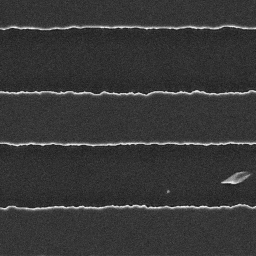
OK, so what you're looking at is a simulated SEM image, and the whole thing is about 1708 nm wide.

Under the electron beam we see lines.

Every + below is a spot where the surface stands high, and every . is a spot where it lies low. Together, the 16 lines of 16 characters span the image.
++++++++++++++++
++++++++++++++++
................
................
................
................
++++++++++++++++
++++++++++++++++
++++++++++++++++
................
................
................
................
++++++++++++++++
++++++++++++++++
++++++++++++++++